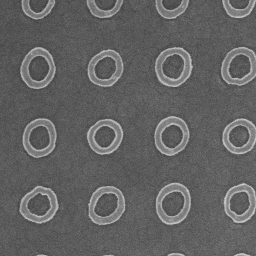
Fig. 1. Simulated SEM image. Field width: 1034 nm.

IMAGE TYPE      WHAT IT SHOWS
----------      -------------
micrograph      a regular array of ring-shaped raised bodies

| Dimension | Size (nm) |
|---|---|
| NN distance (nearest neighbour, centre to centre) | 267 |